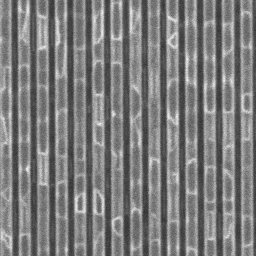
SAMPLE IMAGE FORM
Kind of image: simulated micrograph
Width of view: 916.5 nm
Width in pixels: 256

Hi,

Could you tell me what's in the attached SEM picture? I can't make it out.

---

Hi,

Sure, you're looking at parallel lines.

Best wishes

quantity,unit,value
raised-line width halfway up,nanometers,41.6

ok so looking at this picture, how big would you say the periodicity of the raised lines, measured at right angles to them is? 0.0664 microns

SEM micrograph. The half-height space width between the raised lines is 25.5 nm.